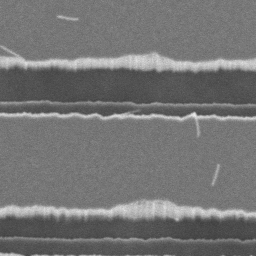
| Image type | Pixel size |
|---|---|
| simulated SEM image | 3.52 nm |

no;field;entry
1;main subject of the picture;lines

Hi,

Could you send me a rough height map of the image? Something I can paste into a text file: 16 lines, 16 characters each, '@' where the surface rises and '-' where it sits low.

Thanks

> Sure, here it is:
@@@@@@@@@@@@@@@@
@@@@@@@@@@@@@@@@
@@@@@@@@@@@@@@@@
@@@@@@@@@@@@@@@@
----------------
----------------
----------------
@@@@@@@@@@@@@@@@
@@@@@@@@@@@@@@@@
@@@@@@@@@@@@@@@@
@@@@@@@@@@@@@@@@
@@@@@@@@@@@@@@@@
@@@@@@@@@@@@@@@@
---------------@
----------------
----------------